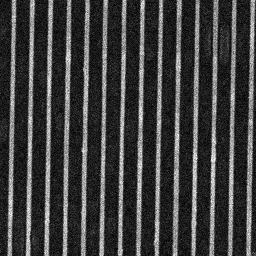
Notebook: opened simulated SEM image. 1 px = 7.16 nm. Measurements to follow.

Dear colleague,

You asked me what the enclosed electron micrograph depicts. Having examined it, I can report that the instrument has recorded parallel lines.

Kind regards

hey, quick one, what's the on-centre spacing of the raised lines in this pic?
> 132 nm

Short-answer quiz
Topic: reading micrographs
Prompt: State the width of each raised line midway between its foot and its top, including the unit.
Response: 27.8 nanometres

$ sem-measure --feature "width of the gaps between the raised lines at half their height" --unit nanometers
104